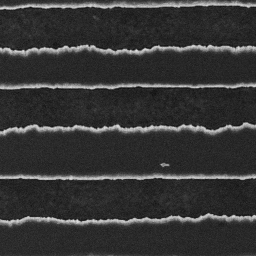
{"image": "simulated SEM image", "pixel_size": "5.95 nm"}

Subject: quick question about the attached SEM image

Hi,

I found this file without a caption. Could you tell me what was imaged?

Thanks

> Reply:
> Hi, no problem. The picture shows lines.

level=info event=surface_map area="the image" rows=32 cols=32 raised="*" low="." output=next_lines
********************************
................................
................................
................................
................................
................................
********************************
********************************
********************************
********************************
********************************
................................
................................
................................
................................
................................
********************************
********************************
********************************
********************************
********************************
********************************
................................
................................
................................
................................
................................
..******......*.****************
********************************
********************************
********************************
********************************